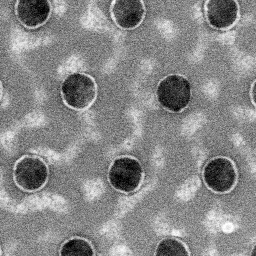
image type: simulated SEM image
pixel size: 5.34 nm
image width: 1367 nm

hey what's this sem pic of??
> raised bodies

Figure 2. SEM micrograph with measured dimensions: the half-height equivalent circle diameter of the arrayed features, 197 nm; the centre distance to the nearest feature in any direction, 0.503 um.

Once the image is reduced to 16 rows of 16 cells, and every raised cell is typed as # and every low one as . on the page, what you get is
.##....##....##.
.##....##....##.
................
................
................
....##....##....
....##....##....
................
................
................
.##....##....##.
.##....##....##.
................
................
................
....##....##....